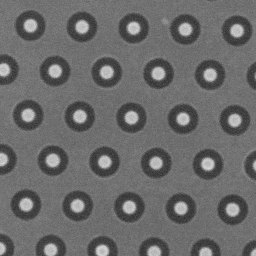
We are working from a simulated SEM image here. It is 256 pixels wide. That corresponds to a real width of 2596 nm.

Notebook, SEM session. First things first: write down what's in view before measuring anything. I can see an array of small figures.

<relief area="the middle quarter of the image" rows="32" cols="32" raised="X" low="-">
--XXXXX-------XXXXXX-------XXXXX
--XXXXX--XXX---XXXXX--XXX---XXXX
--XXXXX--XXX---XXXX---XXX---XXXX
-XXXXXX-------XXXXXX---XX--XXXXX
-XXXXXX-------XXXXXX-------XXXXX
XXXXXXXXX----XXXXXXXX-----XXXXXX
XXXXXXXXXXXXXXXXXXXXXXX-XXXXXXXX
XXXXXXXXXXXXXXXXXXXXXXXXXXXXXXXX
XXXXXXXXXXXXXXXXXXXXXXXXXXXXXXXX
XX----XXXXXXXXXX--XXXXXXXXXXXXXX
X------XXXXXXX------XXXXXXX-----
--------XXXXX-------XXXXXX------
---XX---XXXXX---XX---XXXXX---X--
--XXX---XXXXX---XX---XXXXX--XXX-
---XX---XXXXX---XX---XXXXX---XX-
X------XXXXXX-------XXXXXX------
XX----XXXXXXXX------XXXXXXX-----
XXXXXXXXXXXXXXXX-XXXXXXXXXXX---X
XXXXXXXXXXXXXXXXXXXXXXXXXXXXXXXX
XXXXXXXXXXXXXXXXXXXXXXXXXXXXXXXX
XXXXXXXXX--XXXXXXXXXXXXXXXXXXXXX
XXXXXXX------XXXXXXXX----XXXXXXX
-XXXXXX-------XXXXXX------XXXXXX
-XXXXX---XX---XXXXX---XX---XXXXX
-XXXXX---XXX--XXXXX---XX---XXXXX
-XXXXX---XX---XXXXX---XX---XXXXX
-XXXXXX-------XXXXX--------XXXXX
XXXXXXXX-----XXXXXXX------XXXXXX
XXXXXXXXX--XXXXXXXXXXX---XXXXXXX
XXXXXXXXXXXXXXXXXXXXXXXXXXXXXXXX
XXXXXXXXXXXXXXXXXXXXXXXXXXXXXXXX
XX--XXXXXXXXXXXXXXXXXXXXXXXXXXXX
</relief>